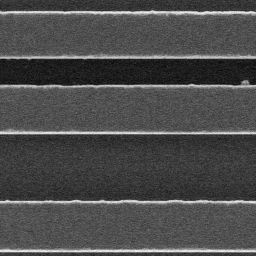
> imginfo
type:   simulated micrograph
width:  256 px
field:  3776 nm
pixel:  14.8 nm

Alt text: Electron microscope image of lines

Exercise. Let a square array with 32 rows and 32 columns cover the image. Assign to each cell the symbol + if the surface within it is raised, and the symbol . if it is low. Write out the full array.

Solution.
................................
++++++++++++++++++++++++++++++++
++++++++++++++++++++++++++++++++
++++++++++++++++++++++++++++++++
++++++++++++++++++++++++++++++++
++++++++++++++++++++++++++++++++
++++++++++++++++++++++++++++++++
................................
................................
................................
................................
++++++++++++++++++++++++++++++++
++++++++++++++++++++++++++++++++
++++++++++++++++++++++++++++++++
++++++++++++++++++++++++++++++++
++++++++++++++++++++++++++++++++
++++++++++++++++++++++++++++++++
................................
................................
................................
................................
................................
................................
................................
................................
++++++++++++++++++++++++++++++++
++++++++++++++++++++++++++++++++
++++++++++++++++++++++++++++++++
++++++++++++++++++++++++++++++++
++++++++++++++++++++++++++++++++
++++++++++++++++++++++++++++++++
................................